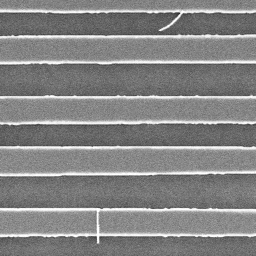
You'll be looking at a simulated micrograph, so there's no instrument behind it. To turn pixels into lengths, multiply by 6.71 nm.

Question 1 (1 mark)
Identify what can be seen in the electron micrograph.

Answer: lines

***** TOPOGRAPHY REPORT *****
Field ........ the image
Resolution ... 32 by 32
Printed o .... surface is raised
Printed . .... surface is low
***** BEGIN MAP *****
oooooooooooooooooooooooooooooooo
.....oooooooo.....oo..oo.oo.oo.o
................................
................................
.............................ooo
oooooooooooooooooooooooooooooooo
oooooooooooooooooooooooooooooooo
oooooooooooooooooooooooooooooooo
................................
................................
................................
................................
oooooooooooooooooooooooooooooooo
oooooooooooooooooooooooooooooooo
oooooooooooooooooooooooooooooooo
.oo.............................
................................
................................
oooooooooooooooooooooooooooooooo
oooooooooooooooooooooooooooooooo
oooooooooooooooooooooooooooooooo
oooooooooooooooooooooooooooooooo
................................
................................
................................
................................
oooooooooooooooooooooooooooooooo
oooooooooooooooooooooooooooooooo
oooooooooooooooooooooooooooooooo
oooo.ooo.o..o.......o.o..ooo....
................................
................................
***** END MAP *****